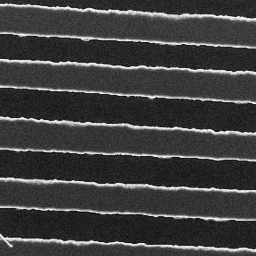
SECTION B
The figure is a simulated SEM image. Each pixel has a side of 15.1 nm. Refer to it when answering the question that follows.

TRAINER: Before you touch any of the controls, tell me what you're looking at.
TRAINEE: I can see lines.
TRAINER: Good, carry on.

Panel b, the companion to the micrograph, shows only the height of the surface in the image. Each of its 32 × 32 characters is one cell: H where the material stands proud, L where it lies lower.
LLLLLLLLLLLLLLLLLLLLLLLLLLLLLLLL
HHHHHHHHHHHHHHHHHLLLLLLLLLLLLLLL
HHHHHHHHHHHHHHHHHHHHHHHHHHHHHHHH
HHHHHHHHHHHHHHHHHHHHHHHHHHHHHHHH
LLLLLLHHHHHHHHHHHHHHHHHHHHHHHHHH
LLLLLLLLLLLLLLLLLLLLLHHHHHHHHHHH
LLLLLLLLLLLLLLLLLLLLLLLLLLLLLLLL
HLLLLLLLLLLLLLLLLLLLLLLLLLLLLLLL
HHHHHHHHHHHHHHHHHHHHHHHLLLLLLLLL
HHHHHHHHHHHHHHHHHHHHHHHHHHHHHHHH
HHHHHHHHHHHHHHHHHHHHHHHHHHHHHHHH
LLLLLLLLLLHHHHHHHHHHHHHHHHHHHHHH
LLLLLLLLLLLLLLLLLLLLLLLLLLHHHHHH
LLLLLLLLLLLLLLLLLLLLLLLLLLLLLLLL
LLLLLLLLLLLLLLLLLLLLLLLLLLLLLLLL
HHHHHHHHHHHHHLLLLLLLLLLLLLLLLLLL
HHHHHHHHHHHHHHHHHHHHHHHHHHHLHLLL
HHHHHHHHHHHHHHHHHHHHHHHHHHHHHHHH
HHHHHHHHHHHHHHHHHHHHHHHHHHHHHHHH
LLLLLLLLLLLLLLLLLLLHHHHHHHHHHHHH
LLLLLLLLLLLLLLLLLLLLLLLLLLLLLLLL
LLLLLLLLLLLLLLLLLLLLLLLLLLLLLLLL
HHHLLLLLLLLLLLLLLLLLLLLLLLLLLLLL
HHHHHHHHHHHHHHHHHHHHHLHHLLLLLLLL
HHHHHHHHHHHHHHHHHHHHHHHHHHHHHHHH
HHHHHHHHHHHHHHHHHHHHHHHHHHHHHHHH
LLLLLLLLLLLLHHHHHHHHHHHHHHHHHHHH
LLLLLLLLLLLLLLLLLLLLLLLLLLLLLLLL
LLLLLLLLLLLLLLLLLLLLLLLLLLLLLLLL
LLLLLLLLLLLLLLLLLLLLLLLLLLLLLLLL
HHHHHHHHHHHHHHHHHHLLLLLLLLLLLLLL
HHHHHHHHHHHHHHHHHHHHHHHHHHHHHHHH